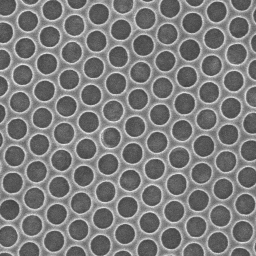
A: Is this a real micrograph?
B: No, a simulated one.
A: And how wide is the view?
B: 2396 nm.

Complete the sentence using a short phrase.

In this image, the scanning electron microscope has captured a regular array of holes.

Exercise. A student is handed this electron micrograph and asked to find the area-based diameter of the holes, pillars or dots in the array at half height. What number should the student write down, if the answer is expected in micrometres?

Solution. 0.196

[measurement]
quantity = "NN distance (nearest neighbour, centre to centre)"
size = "0.251 µm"